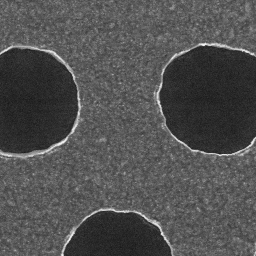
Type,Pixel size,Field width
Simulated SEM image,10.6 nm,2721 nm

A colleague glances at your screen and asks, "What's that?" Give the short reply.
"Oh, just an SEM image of holes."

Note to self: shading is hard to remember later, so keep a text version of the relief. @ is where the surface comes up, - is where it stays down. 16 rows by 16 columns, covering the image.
@@@@@@@@@@@@@@@@
@@@@@@@@@@@@@@@@
@@@@@@@@@@@@@@@@
---@@@@@@@@-----
----@@@@@@------
-----@@@@@------
-----@@@@@------
-----@@@@@------
----@@@@@@@-----
--@@@@@@@@@@@--@
@@@@@@@@@@@@@@@@
@@@@@@@@@@@@@@@@
@@@@@@@@@@@@@@@@
@@@@@@---@@@@@@@
@@@@@-----@@@@@@
@@@@-------@@@@@